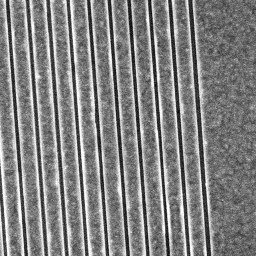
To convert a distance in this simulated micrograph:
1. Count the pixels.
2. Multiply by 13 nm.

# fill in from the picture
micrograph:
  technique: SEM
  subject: parallel lines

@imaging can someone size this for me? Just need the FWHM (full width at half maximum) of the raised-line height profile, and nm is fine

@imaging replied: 204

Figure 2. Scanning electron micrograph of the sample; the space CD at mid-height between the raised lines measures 3.99 pixels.